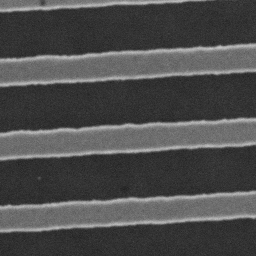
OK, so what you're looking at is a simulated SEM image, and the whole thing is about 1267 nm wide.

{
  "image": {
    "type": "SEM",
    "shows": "lines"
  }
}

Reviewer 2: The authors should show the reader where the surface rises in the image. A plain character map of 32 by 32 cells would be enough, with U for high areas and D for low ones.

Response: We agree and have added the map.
UUUUUUUUUUUUUUDDDDDDDDDDDDDDDDDD
DDDDDDDDDDDDDDDDDDDDDDDDDDDDDDDD
DDDDDDDDDDDDDDDDDDDDDDDDDDDDDDDD
DDDDDDDDDDDDDDDDDDDDDDDDDDDDDDDD
DDDDDDDDDDDDDDDDDDDDDDDDDDDDDDDD
DDDDDDDDDDDDDDDDDDDDDDDDDDDDDDDD
DDDDDDDDDDDDDDDUUUUUUUUUUUUUUUUU
UUUUUUUUUUUUUUUUUUUUUUUUUUUUUUUU
UUUUUUUUUUUUUUUUUUUUUUUUUUUUUUUU
UUUUUUUUUUUUUUUUUUUUUDDDDDDDDDDD
UUUUUDDDDDDDDDDDDDDDDDDDDDDDDDDD
DDDDDDDDDDDDDDDDDDDDDDDDDDDDDDDD
DDDDDDDDDDDDDDDDDDDDDDDDDDDDDDDD
DDDDDDDDDDDDDDDDDDDDDDDDDDDDDDDD
DDDDDDDDDDDDDDDDDDDDDDDDDDDDDDDD
DDDDDDDDDDDDDDDDDDUUUUUUUUUUUUUU
DUUUUUUUUUUUUUUUUUUUUUUUUUUUUUUU
UUUUUUUUUUUUUUUUUUUUUUUUUUUUUUUU
UUUUUUUUUUUUUUUUUUUUUUUDDDDDDDDD
UUUUUUUUUDDDDDDDDDDDDDDDDDDDDDDD
DDDDDDDDDDDDDDDDDDDDDDDDDDDDDDDD
DDDDDDDDDDDDDDDDDDDDDDDDDDDDDDDD
DDDDDDDDDDDDDDDDDDDDDDDDDDDDDDDD
DDDDDDDDDDDDDDDDDDDDDDDDDDDDDDDD
DDDDDDDDDDDDDDDDDDDDDDDDUUUUUUUU
DDDDDDUUUUUUUUUUUUUUUUUUUUUUUUUU
UUUUUUUUUUUUUUUUUUUUUUUUUUUUUUUU
UUUUUUUUUUUUUUUUUUUUUUUUUDDDDDDD
UUUUUUUUUDDDDDDDDDDDDDDDDDDDDDDD
DDDDDDDDDDDDDDDDDDDDDDDDDDDDDDDD
DDDDDDDDDDDDDDDDDDDDDDDDDDDDDDDD
DDDDDDDDDDDDDDDDDDDDDDDDDDDDDDDD